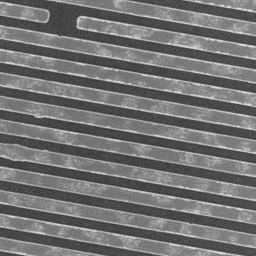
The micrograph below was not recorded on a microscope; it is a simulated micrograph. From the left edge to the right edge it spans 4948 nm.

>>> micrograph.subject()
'parallel lines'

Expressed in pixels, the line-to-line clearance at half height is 10.2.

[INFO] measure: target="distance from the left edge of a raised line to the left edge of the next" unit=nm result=448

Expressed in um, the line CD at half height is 0.245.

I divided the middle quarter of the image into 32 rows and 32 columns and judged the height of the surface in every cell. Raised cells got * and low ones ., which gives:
*******.................********
*************.................**
..*****************.............
........****************........
..............*****.**********..
***................********.****
********.................*******
**************.................*
..******************............
........*******.**********......
..............*****************.
****...............*************
**********...............*******
***************................*
...******************...........
.........*****************......
...............****************.
****.................***********
**********................******
***************.................
.....****************...........
.........******************.....
................****************
*****.................**********
**********................******
*****************...............
.....*****************..........
..........******************....
................****************
*****.................**********
*****.****.................*****
*****.***********...............